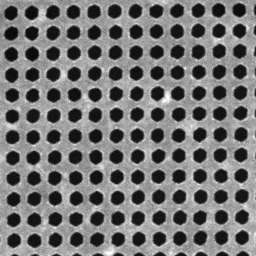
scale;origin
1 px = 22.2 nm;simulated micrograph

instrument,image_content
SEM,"a regular array of holes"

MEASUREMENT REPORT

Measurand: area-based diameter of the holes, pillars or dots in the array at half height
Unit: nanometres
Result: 326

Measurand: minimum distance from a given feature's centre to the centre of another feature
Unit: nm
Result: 449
